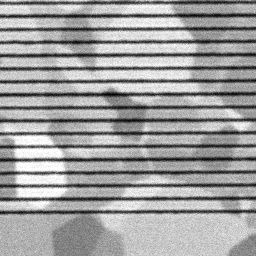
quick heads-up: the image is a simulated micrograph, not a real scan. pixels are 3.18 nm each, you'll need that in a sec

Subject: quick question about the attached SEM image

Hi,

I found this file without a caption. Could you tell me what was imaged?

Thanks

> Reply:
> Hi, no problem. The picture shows parallel lines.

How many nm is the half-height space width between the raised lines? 12.3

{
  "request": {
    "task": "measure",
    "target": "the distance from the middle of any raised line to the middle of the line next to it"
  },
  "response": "41.6 nm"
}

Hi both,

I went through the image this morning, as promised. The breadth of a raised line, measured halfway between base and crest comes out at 30.2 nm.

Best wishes